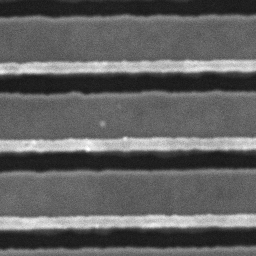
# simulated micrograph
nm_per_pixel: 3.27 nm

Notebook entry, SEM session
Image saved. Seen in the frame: lines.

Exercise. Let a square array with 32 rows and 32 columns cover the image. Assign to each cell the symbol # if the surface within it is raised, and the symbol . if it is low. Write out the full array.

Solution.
................................
................................
################################
################################
################################
################################
################################
################################
################################
................................
................................
...................##.....##....
################################
################################
################################
################################
################################
################################
################################
................................
................................
.##...#.########################
################################
################################
################################
################################
################################
################################
################.#########..#...
................................
................................
################################